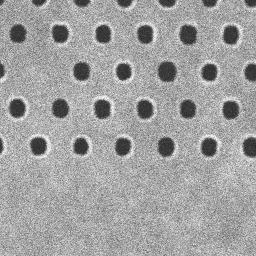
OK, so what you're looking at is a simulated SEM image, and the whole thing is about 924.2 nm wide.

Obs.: a regular array of holes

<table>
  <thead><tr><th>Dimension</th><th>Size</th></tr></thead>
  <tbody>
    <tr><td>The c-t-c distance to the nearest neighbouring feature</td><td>152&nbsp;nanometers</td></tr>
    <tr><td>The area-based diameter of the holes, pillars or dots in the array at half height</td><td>17.6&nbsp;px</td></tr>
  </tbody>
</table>